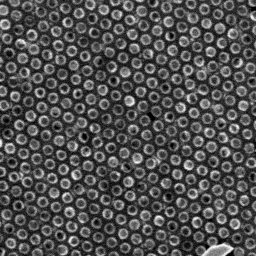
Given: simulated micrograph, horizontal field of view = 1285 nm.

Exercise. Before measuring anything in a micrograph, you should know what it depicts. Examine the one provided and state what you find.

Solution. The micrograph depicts a regular array of raised bodies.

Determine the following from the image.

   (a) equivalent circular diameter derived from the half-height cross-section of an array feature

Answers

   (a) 47.4 nm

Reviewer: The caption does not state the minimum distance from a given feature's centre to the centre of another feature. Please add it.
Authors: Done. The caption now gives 0.0712 um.